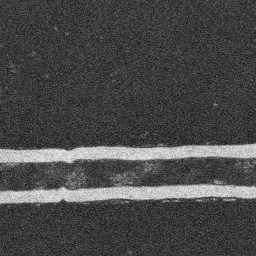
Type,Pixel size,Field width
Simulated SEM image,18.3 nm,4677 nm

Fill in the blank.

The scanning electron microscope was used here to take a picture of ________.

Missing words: one or a few lines or trenches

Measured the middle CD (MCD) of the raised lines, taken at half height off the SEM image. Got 763 nm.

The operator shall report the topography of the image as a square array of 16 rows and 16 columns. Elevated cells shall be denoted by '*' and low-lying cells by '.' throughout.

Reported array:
................
................
................
................
................
................
................
................
................
...........*****
****************
****************
................
................
................
................